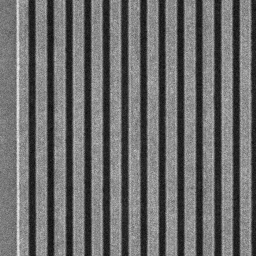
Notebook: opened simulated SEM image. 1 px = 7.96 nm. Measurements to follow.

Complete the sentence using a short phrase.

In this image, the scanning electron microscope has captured parallel lines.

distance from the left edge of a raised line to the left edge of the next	148	nanometres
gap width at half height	0.0676	micrometres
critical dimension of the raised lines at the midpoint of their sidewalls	81.6	nm